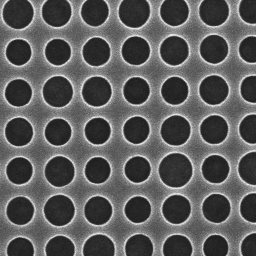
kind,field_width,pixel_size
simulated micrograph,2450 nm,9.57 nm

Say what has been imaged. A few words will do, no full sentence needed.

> a regular array of holes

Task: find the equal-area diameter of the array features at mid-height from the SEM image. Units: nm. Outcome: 271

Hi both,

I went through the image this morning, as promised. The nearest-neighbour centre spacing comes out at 0.371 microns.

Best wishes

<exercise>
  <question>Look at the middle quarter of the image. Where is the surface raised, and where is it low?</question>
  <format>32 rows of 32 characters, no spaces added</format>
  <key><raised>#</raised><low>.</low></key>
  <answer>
#######..#######################
################################
################################
#######...#######..########..###
.####......#####....#####.....##
..###.......###......####......#
..###.......###......###.......#
..##........###......###.......#
..###......####......####......#
.####......#####....######....##
########.#######################
################################
################################
########.########...######....##
.#####.....####......####......#
.####......####......###........
..###.......###......###........
..###.......###......###........
.#####.....####......###.......#
.######....######...#####.....##
###########################.####
################################
##########################...###
.######...#######...#####......#
..####.....#####.....###........
...##......####.......##........
...##.......###.......##........
...##......####......###........
..####.....#####.....###........
..#####...#######..######......#
##########################....##
################################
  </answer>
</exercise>